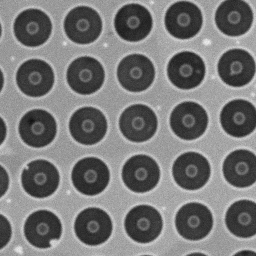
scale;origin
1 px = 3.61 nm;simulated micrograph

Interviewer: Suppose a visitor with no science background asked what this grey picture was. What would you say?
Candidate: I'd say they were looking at an array of small figures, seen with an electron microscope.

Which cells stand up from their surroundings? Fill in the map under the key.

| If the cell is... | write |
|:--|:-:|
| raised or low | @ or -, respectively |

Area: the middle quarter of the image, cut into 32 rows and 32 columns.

@---------@@@----------@@@----@-
@---------@@@----@@----@@@---@@@
----@@@---@@@----@@----@@@---@@@
----@@@---@@@----------@@@------
@---------@@@---------@@@@@-----
@---------@@@@--------@@@@@@----
@@-------@@@@@@------@@@@@@@@---
@@@----@@@@@@@@@@@@@@@@@@@@@@@@@
@@@@@@@@@@@@@@@@@@@@@@@@@@@@@@@@
@@@@@@@@@@@@@@@@@@@@@@@@@@@@@---
@@@@@--@@@@@@@@@-----@@@@@@@----
@@@------@@@@@@-------@@@@@-----
@@--------@@@@---------@@@@-----
@----------@@@----@----@@@----@@
@----@@----@@@---@@@----@@----@@
@----@@----@@@---@@@----@@-----@
@----@@----@@@---------@@@@-----
@----------@@@---------@@@@-----
@@--------@@@@@-------@@@@@@@---
@@@------@@@@@@@@---@@@@@@@@@@@@
@@@@@@-@@@@@@@@@@@@@@@@@@@@@@@@@
@@@@@@@@@@@@@@@@@@@@@@@@@@@@@@@@
@@@@@@@@@@@@@@@@@@--@@@@@@@@@---
@@@@@----@@@@@@@------@@@@@@----
@@@-------@@@@@--------@@@@-----
@@---------@@@@---------@@@----@
@@---------@@@----@@----@@@----@
@@---@@@----@@----@@@---@@@----@
@@---@@@----@@----@@----@@@-----
@@---------@@@@---------@@@@----
@@---------@@@@--------@@@@@----
@@@-------@@@@@@------@@@@@@@@--